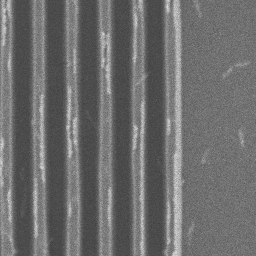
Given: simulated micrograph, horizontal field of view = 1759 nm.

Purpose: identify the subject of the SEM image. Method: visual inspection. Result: parallel lines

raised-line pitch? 228 nanometres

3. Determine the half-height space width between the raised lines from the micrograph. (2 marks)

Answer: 133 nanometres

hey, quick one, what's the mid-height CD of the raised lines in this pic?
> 0.0953 µm